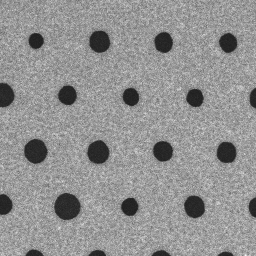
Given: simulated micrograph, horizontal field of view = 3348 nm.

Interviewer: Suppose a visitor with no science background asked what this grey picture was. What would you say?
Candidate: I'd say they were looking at a regular array of holes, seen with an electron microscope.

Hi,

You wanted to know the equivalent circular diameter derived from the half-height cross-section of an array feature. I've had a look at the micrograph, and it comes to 254 nanometres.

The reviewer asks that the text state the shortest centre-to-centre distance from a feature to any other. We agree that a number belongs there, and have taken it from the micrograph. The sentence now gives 822 nanometres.